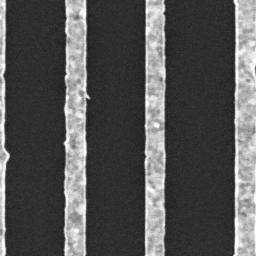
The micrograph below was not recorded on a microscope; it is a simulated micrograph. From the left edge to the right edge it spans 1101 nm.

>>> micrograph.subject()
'one or a few lines or trenches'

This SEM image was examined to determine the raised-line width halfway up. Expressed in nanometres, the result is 76.9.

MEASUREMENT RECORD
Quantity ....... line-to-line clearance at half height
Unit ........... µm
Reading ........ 0.27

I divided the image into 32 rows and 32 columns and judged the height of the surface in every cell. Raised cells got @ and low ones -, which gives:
--------@@@-------@@---------@@@
--------@@@-------@@----------@@
--------@@@-------@@@---------@@
--------@@@-------@@----------@@
--------@@@-------@@----------@@
--------@@@-------@@----------@@
--------@@@-------@@----------@@
--------@@@-------@@----------@@
--------@@@-------@@----------@@
--------@@@-------@@----------@@
--------@@@-------@@----------@@
--------@@@-------@@----------@@
--------@@@-------@@----------@@
--------@@@-------@@----------@@
--------@@@-------@@----------@@
--------@@@-------@@----------@@
--------@@@-------@@----------@@
--------@@@-------@@----------@@
--------@@@-------@@----------@@
@-------@@@-------@@@---------@@
@-------@@@-------@@----------@@
--------@@@-------@@----------@@
--------@@@-------@@----------@@
--------@@@-------@@----------@@
--------@@@-------@@----------@@
--------@@@-------@@----------@@
--------@@--------@@----------@@
--------@@--------@@----------@@
--------@@--------@@----------@@
--------@@--------@@----------@@
--------@@--------@@----------@@
@-------@@--------@@----------@@